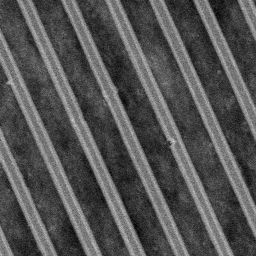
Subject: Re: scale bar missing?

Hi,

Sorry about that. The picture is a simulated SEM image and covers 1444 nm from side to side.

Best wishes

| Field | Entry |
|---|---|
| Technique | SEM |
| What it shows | parallel lines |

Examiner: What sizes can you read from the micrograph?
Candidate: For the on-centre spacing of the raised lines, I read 227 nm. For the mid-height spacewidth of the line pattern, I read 167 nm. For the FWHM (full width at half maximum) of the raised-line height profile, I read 0.0591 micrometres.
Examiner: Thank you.